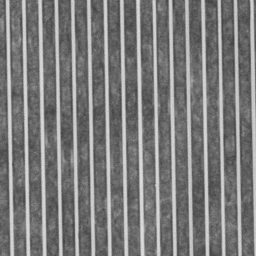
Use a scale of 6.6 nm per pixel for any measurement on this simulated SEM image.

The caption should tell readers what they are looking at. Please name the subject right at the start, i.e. parallel lines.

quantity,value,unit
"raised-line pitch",16.3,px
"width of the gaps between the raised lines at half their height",88.2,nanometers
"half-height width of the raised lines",18.1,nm